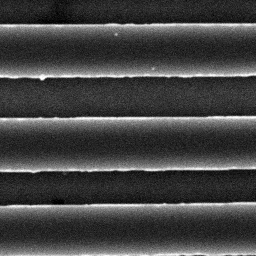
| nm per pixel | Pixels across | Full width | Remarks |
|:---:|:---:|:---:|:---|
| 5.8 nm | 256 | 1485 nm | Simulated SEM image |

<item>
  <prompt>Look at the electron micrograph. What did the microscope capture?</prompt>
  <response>lines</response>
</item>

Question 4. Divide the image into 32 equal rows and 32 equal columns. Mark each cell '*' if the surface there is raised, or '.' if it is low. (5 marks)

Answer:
................................
................................
................................
********************************
********************************
********************************
********************************
********************************
********************************
*****************....***........
................................
................................
................................
................................
................................
********************************
********************************
********************************
********************************
********************************
********************************
....*...........................
................................
................................
................................
....................*.**********
********************************
********************************
********************************
********************************
********************************
********************************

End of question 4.